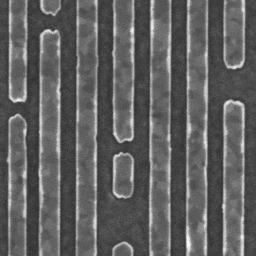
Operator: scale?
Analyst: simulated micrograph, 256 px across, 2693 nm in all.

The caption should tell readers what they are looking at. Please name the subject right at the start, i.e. parallel lines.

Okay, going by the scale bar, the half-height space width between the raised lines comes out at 179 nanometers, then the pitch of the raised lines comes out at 379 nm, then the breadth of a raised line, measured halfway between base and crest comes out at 206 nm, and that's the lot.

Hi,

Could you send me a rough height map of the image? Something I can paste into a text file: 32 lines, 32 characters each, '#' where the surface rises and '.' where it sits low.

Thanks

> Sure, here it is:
.##..##...##..###..##..###..###.
.##...#...##..###..##..###..###.
.##.......##..###..##..###..###.
.##.......##..###..##..###..###.
.##..##...##..###..##..###..##..
.##..##...##..###..##..###..##..
.##..##...##..###..##..###..##..
.##..##...##..###..##..###..##..
.##..##...##..###..##..###......
.##..##...##..###..##..###......
.##..##...##..###..##..###......
.##..##...##..###..##..###......
..#..##...##..###..##...##......
.....##...##..###..##...##..##..
.....##...##..###..##...##..##..
.##..##...##..###..##...##..##..
.##..##...##..###..##..###..##..
.##..##...##...#...##..###..##..
.##..##...##.......##..###..##..
.##..##...##...#...##..###..##..
.##..##...##..###..##..###..##..
.##..##...##..###..##..###..##..
.##..##...##..###..##..###..##..
.##..##...##..###..##..###..##..
.##..##...##...#...##..###..##..
.##..##...##.......##..###..##..
.##..##...##.......##..###..##..
.##..##...##.......##..###..##..
.##..##...##.......##..###..##..
.##..##...##.......##..###..##..
.##..##...##...#...##..###..##..
.##..##...##..##...##..###..##..